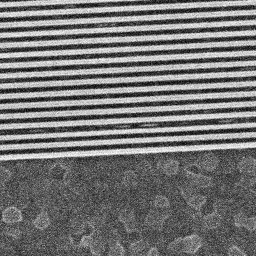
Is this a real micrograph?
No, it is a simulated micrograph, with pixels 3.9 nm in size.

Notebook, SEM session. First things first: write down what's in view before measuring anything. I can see parallel lines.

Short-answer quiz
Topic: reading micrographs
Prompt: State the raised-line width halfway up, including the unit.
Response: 14.1 nanometres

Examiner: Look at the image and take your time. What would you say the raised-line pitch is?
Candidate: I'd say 0.0397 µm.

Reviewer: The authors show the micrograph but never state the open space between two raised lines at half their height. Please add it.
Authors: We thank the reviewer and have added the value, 24.3 nm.